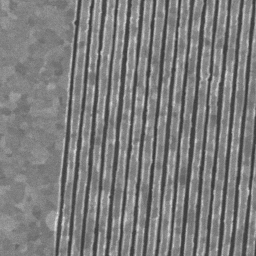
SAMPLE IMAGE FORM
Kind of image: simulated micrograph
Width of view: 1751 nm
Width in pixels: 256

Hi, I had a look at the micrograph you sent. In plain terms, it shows parallel lines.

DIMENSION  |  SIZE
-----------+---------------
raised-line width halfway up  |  54.4 nm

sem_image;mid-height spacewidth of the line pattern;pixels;4.85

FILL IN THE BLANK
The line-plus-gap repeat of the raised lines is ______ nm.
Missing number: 85